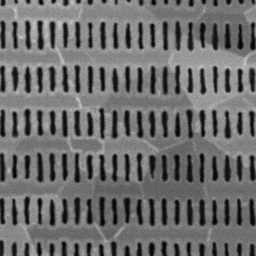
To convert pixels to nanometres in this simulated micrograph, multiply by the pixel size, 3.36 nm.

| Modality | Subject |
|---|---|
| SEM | a regular array of holes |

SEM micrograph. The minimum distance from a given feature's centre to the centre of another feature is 41.7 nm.